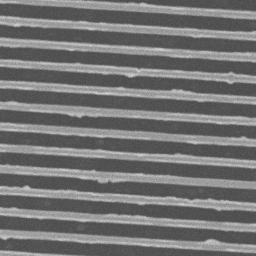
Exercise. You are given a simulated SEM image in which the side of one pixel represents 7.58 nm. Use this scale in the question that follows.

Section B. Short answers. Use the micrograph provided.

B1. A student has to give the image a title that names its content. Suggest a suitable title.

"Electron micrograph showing parallel lines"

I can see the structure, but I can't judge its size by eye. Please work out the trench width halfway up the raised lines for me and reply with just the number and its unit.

101 nm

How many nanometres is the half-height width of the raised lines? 57.7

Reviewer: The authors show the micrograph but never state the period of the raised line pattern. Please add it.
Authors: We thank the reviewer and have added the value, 161 nm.